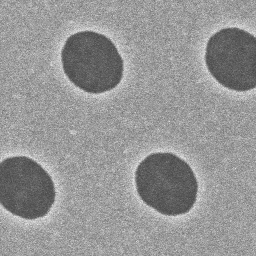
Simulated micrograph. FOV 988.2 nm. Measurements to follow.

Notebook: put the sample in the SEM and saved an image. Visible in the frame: holes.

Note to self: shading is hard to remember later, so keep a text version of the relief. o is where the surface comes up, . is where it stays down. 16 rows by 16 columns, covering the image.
oooooooooooooooo
oooooooooooooooo
oooo...oooooo...
oooo....ooooo...
oooo....ooooo...
ooooo..ooooooo..
oooooooooooooooo
oooooooooooooooo
oooooooooooooooo
oooooooooooooooo
...oooooo...oooo
...ooooo....oooo
...oooooo...oooo
o..ooooooooooooo
oooooooooooooooo
oooooooooooooooo